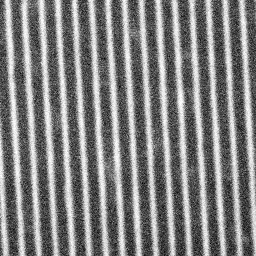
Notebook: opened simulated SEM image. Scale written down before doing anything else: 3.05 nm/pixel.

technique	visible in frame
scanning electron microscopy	parallel lines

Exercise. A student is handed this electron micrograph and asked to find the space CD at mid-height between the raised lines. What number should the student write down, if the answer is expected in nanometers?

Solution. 37.7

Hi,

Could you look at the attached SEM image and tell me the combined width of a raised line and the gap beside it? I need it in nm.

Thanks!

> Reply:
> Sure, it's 51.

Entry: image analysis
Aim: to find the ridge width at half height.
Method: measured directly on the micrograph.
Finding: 12.6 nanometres